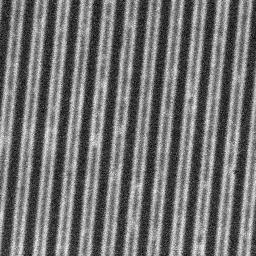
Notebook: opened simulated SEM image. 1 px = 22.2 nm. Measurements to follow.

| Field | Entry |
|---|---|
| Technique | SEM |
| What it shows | parallel lines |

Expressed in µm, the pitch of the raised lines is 0.502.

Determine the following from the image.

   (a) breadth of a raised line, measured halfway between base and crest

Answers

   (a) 210 nm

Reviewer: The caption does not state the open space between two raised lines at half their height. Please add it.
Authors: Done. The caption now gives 13.1 pixels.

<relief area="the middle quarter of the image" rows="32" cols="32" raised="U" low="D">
DDDUUDDDDUUDDDUUUDDDUUDDDDUUDDDU
DDDUUDDDDUUDDDUUDDDDUUDDDDUUDDDU
DDDUUDDDUUUDDDUUDDDDUUDDDDUUDDDU
DDDUUDDDUUUDDDUUDDDDUUDDDDUUDDDU
DDDUUDDDUUDDDDUUDDDDUUDDDUUUDDDU
DDUUUDDDUUDDDDUUDDDDUUDDDUUUDDDU
DDUUUDDDUUDDDDUUDDDDUUDDDUUDDDDU
DDUUUDDDUUDDDDUUDDDUUUDDDUUDDDDU
DDUUDDDDUUDDDDUUDDDUUUDDDUUDDDDU
DDUUDDDDUUDDDDUUDDDUUDDDDUUDDDDU
DDUUDDDDUUDDDDUUDDDUUDDDDUUDDDUU
DDUUDDDDUUDDDUUDDDDUUDDDDUUDDDUU
DDUUDDDUUUDDDUUDDDDUUDDDDUUDDDUU
DDUUDDDUUUDDDUUDDDDUUDDDDUUDDDUU
DDUUDDDUUDDDDUUDDDDUUDDDUUUDDDUU
DDUUDDDUUDDDDUUDDDDUUDDDUUUDDDUU
DUUUDDDUUDDDDUUDDDDUUDDDUUDDDDUU
DUUUDDDUUDDDDUUDDDUUUDDDUUDDDDUU
DUUDDDDUUDDDDUUDDDUUUDDDUUDDDDUU
DUUDDDDUUDDDDUUDDDUUDDDDUUDDDDUU
DUUDDDDUUDDDDUUDDDUUDDDDUUDDDUUU
DUUDDDDUUDDDUUDDDDUUDDDDUUDDDUUU
DUUDDDUUUDDDUUDDDDUUDDDDUUDDDUUD
DUUDDDUUUDDDUUDDDDUUDDDDUUDDDUUD
DUUDDDUUDDDDUUDDDDUUDDDUUUDDDUUD
DUUDDDUUDDDDUUDDDDUUDDDUUUDDDUUD
UUUDDDUUDDDDUUDDDDUUDDDUUDDDDUUD
UUUDDDUUDDDDUUDDDUUDDDDUUDDDDUUD
UUDDDDUUDDDDUUDDDUUDDDDUUDDDDUUD
UUDDDDUUDDDDUUDDDUUDDDDUUDDDDUUD
UUDDDDUUDDDDUUDDDUUDDDDUUDDDUUUD
UUDDDDUUDDDUUDDDDUUDDDDUUDDDUUUD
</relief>